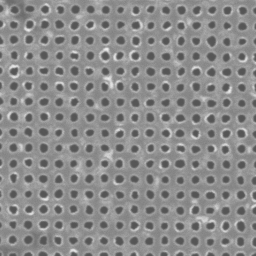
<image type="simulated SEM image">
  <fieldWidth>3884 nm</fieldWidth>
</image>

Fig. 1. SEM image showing a regular array of holes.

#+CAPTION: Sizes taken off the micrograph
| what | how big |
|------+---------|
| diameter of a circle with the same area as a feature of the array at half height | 121 nm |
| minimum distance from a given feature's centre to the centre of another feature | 225 nm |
